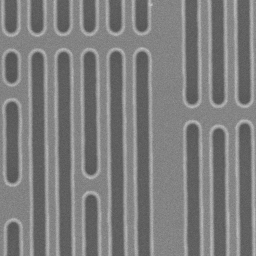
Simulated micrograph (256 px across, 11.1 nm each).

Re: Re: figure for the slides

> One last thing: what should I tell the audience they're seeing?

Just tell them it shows groups of lines, slits or small figures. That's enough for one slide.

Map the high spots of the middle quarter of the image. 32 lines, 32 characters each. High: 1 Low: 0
00111000111000011100001111111100
00111000111000011100001111111100
00111000111000011100011111111100
00111000011000011100011111111100
00111000011000011100011111111100
00111000011000011100011111111100
00111000011000011100001111111100
00111000011000011100001111111100
00111000011000011100001111111100
00111000011000011100001111111100
00111000011000011100001111111111
00111000011000011100001111111111
00111000011000011100001111111111
00111000011000011100001111111111
00111000011000011100001111111111
00111000011000011100001111111110
00111000011000011100001111111100
00111000011000011100001111111100
00111000011000011100001111111100
00111000011000011100001111111100
00111000011000011100001111111100
00111000011000011100001111111100
00111000011000011100001111111100
00111000011000011100001111111100
00111000011000011100001111111100
00111000011000011100001111111100
00111000011000011100001111111100
00111000111000011100001111111100
00111111111000011100001111111100
00111111111000011100001111111100
00111111111000011100001111111100
00111111111000011100001111111100